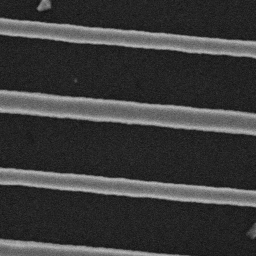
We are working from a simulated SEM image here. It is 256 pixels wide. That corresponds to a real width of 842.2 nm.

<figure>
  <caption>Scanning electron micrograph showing lines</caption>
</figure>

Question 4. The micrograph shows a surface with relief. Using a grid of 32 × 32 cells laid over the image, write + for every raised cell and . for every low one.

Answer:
................................
................................
++..............................
+++++++++++.....................
..++++++++++++++++++++++........
.............+++++++++++++++++++
.......................+++++++++
................................
................................
................................
................................
++..............................
++++++++++++....................
++++++++++++++++++++++++........
......++++++++++++++++++++++++++
..................++++++++++++++
.............................+++
................................
................................
................................
................................
++++++..........................
+++++++++++++++++...............
.....++++++++++++++++++++++.....
................++++++++++++++++
............................++++
................................
................................
................................
................................
+++++...........................
+++++++++++++++++...............